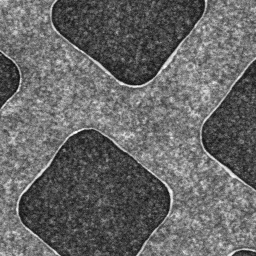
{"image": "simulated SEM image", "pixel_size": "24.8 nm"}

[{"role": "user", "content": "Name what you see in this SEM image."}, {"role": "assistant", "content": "holes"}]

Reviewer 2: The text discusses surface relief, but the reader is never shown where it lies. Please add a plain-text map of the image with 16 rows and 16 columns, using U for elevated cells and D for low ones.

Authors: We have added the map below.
UUUDDDDDDDDDDUUU
UUUDDDDDDDDDUUUU
UUUUDDDDDDDDUUUU
UUUUUUDDDDDUUUUU
DUUUUUUDDDUUUUUD
DUUUUUUUUUUUUUDD
UUUUUUUUUUUUUUDD
UUUUUUUUUUUUUDDD
UUUUDDDUUUUUUDDD
UUUUDDDDUUUUUDDD
UUUDDDDDDUUUUUDD
UUDDDDDDDDUUUUUD
UDDDDDDDDDDUUUUU
UDDDDDDDDDUUUUUU
UUDDDDDDDDUUUUUU
UUUDDDDDDUUUUUUU